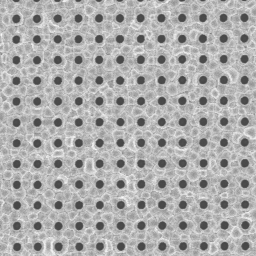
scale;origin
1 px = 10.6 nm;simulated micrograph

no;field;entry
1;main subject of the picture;a regular array of holes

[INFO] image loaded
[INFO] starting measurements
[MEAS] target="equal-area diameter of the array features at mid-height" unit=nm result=89.2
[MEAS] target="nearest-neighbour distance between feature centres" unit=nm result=216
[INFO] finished